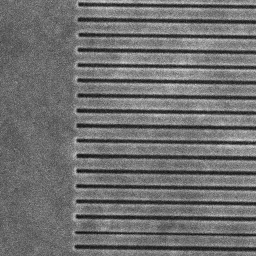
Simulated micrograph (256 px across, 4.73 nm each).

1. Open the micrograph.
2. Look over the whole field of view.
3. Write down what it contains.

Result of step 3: parallel lines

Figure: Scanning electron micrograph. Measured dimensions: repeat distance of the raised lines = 71.7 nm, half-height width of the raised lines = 46.2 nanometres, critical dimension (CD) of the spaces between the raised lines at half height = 25.4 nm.